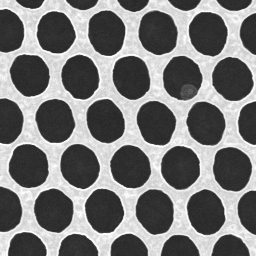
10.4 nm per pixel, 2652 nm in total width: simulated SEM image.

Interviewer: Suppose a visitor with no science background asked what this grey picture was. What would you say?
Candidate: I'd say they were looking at a regular array of holes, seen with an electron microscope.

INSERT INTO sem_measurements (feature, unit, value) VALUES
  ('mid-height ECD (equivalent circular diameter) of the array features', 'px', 41.5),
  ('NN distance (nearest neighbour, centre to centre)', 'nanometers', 521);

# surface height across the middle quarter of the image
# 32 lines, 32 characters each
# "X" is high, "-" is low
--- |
--------XXXXX--------XXXXX------
--------XXXX---------XXXX-------
---------XXX---------XXXX-------
---------XXX---------XXXX-------
---------XXX----------XXX-------
---------XXXX---------XXX-------
--------XXXXX--------XXXX-------
XX-----XXXXXXX------XXXXXX------
XXX---XXXXXXXXX----XXXXXXXXX----
XXXXXXX-----XXXXXXXXX---XXXXXXXX
-XXXXX-------XXXXXX-------XXXXXX
--XXXX--------XXXXX--------XXXX-
--XXXX---------XXX---------XXXX-
--XXX----------XXX----------XXX-
---XXX---------XXX----------XX--
---XXX---------XXX----------XXX-
---XXX---------XXXX---------XXX-
--XXXXX--------XXXX--------XXXX-
-XXXXXXX------XXXXXX-------XXXXX
XXXXXXXXX---XXXXXXXXX-----XXXXXX
X-----XXXXXXXXX--XXXXXXXXXXX-XXX
-------XXXXXXX-----XXXXXXX------
--------XXXXX-------XXXXX-------
--------XXXX---------XXXX-------
---------XXX---------XXX--------
---------XXX----------XX--------
---------XXX----------XX--------
---------XXX----------XX--------
--------XXXX---------XXXX-------
X-------XXXXX--------XXXX-------
XX-----XXXXXXXX----XXXXXXXX----X
XXXXXXXX---XXXXXXXXXX--XXXXX-XXX